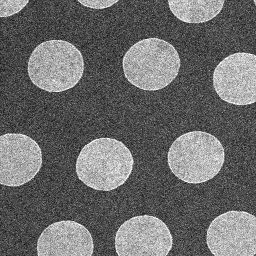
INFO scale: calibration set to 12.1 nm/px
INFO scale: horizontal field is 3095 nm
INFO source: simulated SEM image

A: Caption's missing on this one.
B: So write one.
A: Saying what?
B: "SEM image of raised bodies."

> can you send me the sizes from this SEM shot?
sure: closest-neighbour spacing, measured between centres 1140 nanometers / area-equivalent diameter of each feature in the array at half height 0.652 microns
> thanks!